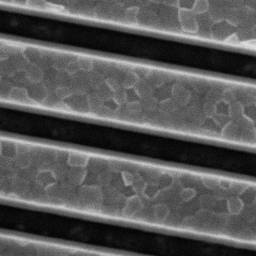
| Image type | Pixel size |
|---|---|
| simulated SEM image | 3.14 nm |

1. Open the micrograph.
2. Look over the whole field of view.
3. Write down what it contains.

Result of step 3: one or a few lines or trenches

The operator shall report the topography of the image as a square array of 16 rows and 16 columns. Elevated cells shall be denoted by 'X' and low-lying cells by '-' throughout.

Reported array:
-XXXXXXXXXXXXXXX
------XXXXXXXXXX
X-----------XXXX
XXXXXXX---------
XXXXXXXXXXXX----
XXXXXXXXXXXXXXXX
XXXXXXXXXXXXXXXX
------XXXXXXXXXX
-----------XXXXX
XXXXXX----------
XXXXXXXXXXXX----
XXXXXXXXXXXXXXXX
XXXXXXXXXXXXXXXX
-----XXXXXXXXXXX
-----------XXXXX
XXXXX-----------